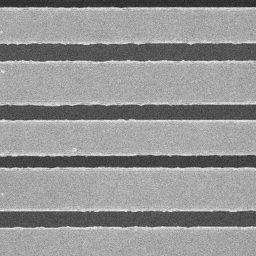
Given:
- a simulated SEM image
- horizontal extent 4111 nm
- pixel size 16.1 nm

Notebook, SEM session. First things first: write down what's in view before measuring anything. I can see lines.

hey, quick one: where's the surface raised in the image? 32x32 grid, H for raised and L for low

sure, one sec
LLLLLLLLLLLLLLLLLLLLLLLLLLLLLLLL
HHHHHHHHHHHHHHHHHHHHHHHHHHHHHHHH
HHHHHHHHHHHHHHHHHHHHHHHHHHHHHHHH
HHHHHHHHHHHHHHHHHHHHHHHHHHHHHHHH
HHHHHHHHHHHHHHHHHHHHHHHHHHHHHHHH
LLLLLLLLLLLLLLLLLLLLLLLLLLLLLLLL
LLLLLLLLLLLLLLLLLLLLLLLLLLLLLLLL
LLLLLLLLLLLLLLLLLLLLLLLLLLLLLLLL
HHHHHHHHHHHHHHHHHHHHHHHHHHHHHHHH
HHHHHHHHHHHHHHHHHHHHHHHHHHHHHHHH
HHHHHHHHHHHHHHHHHHHHHHHHHHHHHHHH
HHHHHHHHHHHHHHHHHHHHHHHHHHHHHHHH
HHHHHHHHHHHHHHHHHHHHHHHHHHHHHHHH
LLLLLLLLLLLLLLLLLLLLLLLLLLLLLLLL
LLLLLLLLLLLLLLLLLLLLLLLLLLLLLLLL
HHHHHHHHHHHHHHHHHHHHHHHHHHHHHHHH
HHHHHHHHHHHHHHHHHHHHHHHHHHHHHHHH
HHHHHHHHHHHHHHHHHHHHHHHHHHHHHHHH
HHHHHHHHHHHHHHHHHHHHHHHHHHHHHHHH
LLLLLLLLLLLLLLLLLLLLLLLLLLLLLLLL
LLLLLLLLLLLLLLLLLLLLLLLLLLLLLLLL
HHHHHHHHHHHHHHHHHHHHHHHHHHHHHHHH
HHHHHHHHHHHHHHHHHHHHHHHHHHHHHHHH
HHHHHHHHHHHHHHHHHHHHHHHHHHHHHHHH
HHHHHHHHHHHHHHHHHHHHHHHHHHHHHHHH
HHHHHHHHHHHHHHHHHHHHHHHHHHHHHHHH
LLLLLLLLLLLLLLLLLLLLLLLLLLLLLLLL
LLLLLLLLLLLLLLLLLLLLLLLLLLLLLLLL
LHHLHHLHHHHHHHHLHHHHHHHHHHHHHHHH
HHHHHHHHHHHHHHHHHHHHHHHHHHHHHHHH
HHHHHHHHHHHHHHHHHHHHHHHHHHHHHHHH
HHHHHHHHHHHHHHHHHHHHHHHHHHHHHHHH